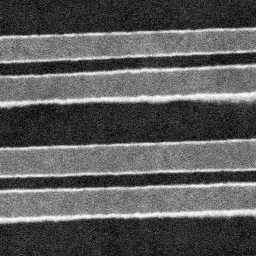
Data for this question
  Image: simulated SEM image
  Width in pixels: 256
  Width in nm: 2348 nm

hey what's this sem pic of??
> lines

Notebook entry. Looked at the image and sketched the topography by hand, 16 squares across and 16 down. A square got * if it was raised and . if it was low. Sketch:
................
................
****************
****************
****************
****************
................
................
................
****************
****************
****************
****************
******..........
................
................